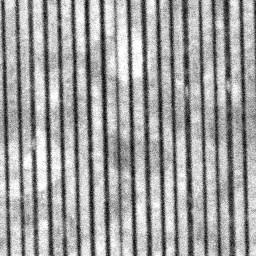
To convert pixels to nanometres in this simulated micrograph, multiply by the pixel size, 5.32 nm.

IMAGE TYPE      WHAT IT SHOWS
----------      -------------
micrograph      parallel lines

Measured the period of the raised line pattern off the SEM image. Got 0.0746 micrometres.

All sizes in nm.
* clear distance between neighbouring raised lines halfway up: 29.9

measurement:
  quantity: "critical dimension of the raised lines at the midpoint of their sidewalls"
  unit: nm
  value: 45.2